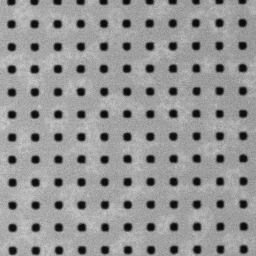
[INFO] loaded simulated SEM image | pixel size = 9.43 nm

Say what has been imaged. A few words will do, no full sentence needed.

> a regular array of holes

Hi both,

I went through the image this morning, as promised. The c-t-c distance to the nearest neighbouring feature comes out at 212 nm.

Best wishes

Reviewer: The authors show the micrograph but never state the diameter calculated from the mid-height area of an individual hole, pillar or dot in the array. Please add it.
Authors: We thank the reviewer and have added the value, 83.1 nanometres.